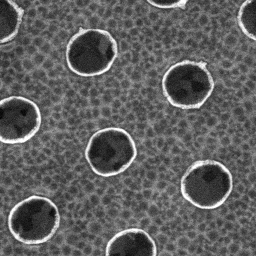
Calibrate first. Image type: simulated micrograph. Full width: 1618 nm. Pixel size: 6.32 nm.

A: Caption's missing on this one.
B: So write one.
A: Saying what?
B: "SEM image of raised bodies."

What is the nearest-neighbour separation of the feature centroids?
101 px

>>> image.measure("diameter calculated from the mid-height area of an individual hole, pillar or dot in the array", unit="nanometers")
304